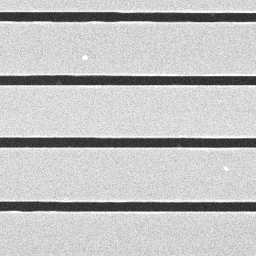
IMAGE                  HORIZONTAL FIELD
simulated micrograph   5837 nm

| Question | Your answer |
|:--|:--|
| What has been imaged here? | lines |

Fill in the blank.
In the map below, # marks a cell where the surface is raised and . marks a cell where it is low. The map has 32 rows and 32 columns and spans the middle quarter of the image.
################################
################################
################################
................................
................................
...........#....................
################################
################################
################################
################################
################################
################################
################################
################################
################################
################################
################################
################################
................................
................................
................................
################################
################################
################################
################################
################################
################################
################################
################################
################################
################################
################################